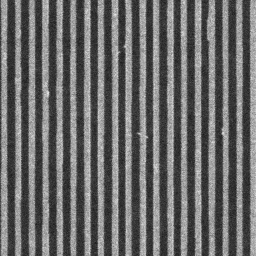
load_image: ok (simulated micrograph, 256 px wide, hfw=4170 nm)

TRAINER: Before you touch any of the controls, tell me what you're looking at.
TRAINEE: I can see parallel lines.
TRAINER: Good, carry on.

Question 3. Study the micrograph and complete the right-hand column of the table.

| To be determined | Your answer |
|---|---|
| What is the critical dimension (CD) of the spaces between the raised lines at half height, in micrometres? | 0.145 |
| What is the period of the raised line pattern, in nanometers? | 225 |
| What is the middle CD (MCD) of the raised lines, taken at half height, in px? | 5.13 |